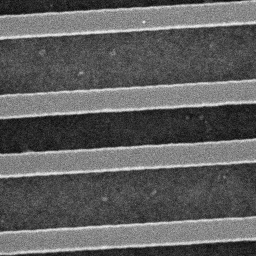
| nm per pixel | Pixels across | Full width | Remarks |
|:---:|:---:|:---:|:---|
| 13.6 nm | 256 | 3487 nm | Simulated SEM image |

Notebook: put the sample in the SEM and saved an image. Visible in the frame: lines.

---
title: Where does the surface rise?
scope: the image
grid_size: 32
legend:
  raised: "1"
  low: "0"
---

00000000000000000000000001111111
00000000011111111111111111111111
11111111111111111111111111111111
11111111111111111111111000000000
11111100000000000000000000000000
00000000000000000000000000000000
00000000000000000000000000000000
00000000000000000000000000000000
00000000000000000000000000000000
00000000000000000000000000000000
00000000000000000000000111111111
00000001111111111111111111111111
11111111111111111111111111111111
11111111111111111111110000000000
11111000000000000000000000000000
00000000000000000000000000000000
00000000000000000000000000000000
00000000000000000000000000000011
00000000000000111111111111111111
11111111111111111111111111111111
11111111111111111111111111111000
11111111111100000000000000000000
00000000000000000000000000000000
00000000000000000000000000000000
00000000000000000000000000000000
00000000000000000000000000000000
00000000000000000000000000000000
00000000000000000000000011111111
00000000011111111111111111111111
11111111111111111111111111111111
11111111111111111111111100000000
11111100000000000000000000000000